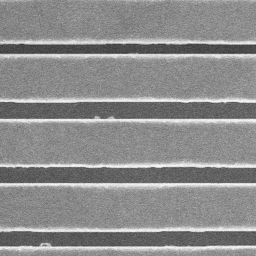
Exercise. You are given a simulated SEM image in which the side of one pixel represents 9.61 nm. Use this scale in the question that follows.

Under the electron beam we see lines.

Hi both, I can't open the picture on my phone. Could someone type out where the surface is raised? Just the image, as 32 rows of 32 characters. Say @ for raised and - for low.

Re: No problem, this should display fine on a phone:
@@@@@@@@@@@@@@@@@@@@@@@@@@@@@@@@
@@@@@@@@@@@@@@@@@@@@@@@@@@@@@@@@
@@@@@@@@@@@@@@@@@@@@@@@@@@@@@@@@
@@@@@@@@@@@@@@@@@@@@@@@@@@@@@@@@
@@@@@@@@@@@@@@@@@@@@@@@@@@@@@@@@
--------------------------------
--------------------------------
@@@@@@@@@@@@@@@@@@@@@@@@@@@@@@@@
@@@@@@@@@@@@@@@@@@@@@@@@@@@@@@@@
@@@@@@@@@@@@@@@@@@@@@@@@@@@@@@@@
@@@@@@@@@@@@@@@@@@@@@@@@@@@@@@@@
@@@@@@@@@@@@@@@@@@@@@@@@@@@@@@@@
@@@@@@@@@@@@@@@@@@@@@@@@@@@@@@@@
--------------------------------
--------------------------------
@@@@@@@@@@@@@@@@@@@@@@@@@@@@@@@@
@@@@@@@@@@@@@@@@@@@@@@@@@@@@@@@@
@@@@@@@@@@@@@@@@@@@@@@@@@@@@@@@@
@@@@@@@@@@@@@@@@@@@@@@@@@@@@@@@@
@@@@@@@@@@@@@@@@@@@@@@@@@@@@@@@@
@@@@@@@@@@@@@@@@@@@@@@@@@@@@@@@@
--------------------------------
--------------------------------
@@@@@@@@@@@@@@@@@@@@@@@@@@@@@@@@
@@@@@@@@@@@@@@@@@@@@@@@@@@@@@@@@
@@@@@@@@@@@@@@@@@@@@@@@@@@@@@@@@
@@@@@@@@@@@@@@@@@@@@@@@@@@@@@@@@
@@@@@@@@@@@@@@@@@@@@@@@@@@@@@@@@
@@@@@@@@@@@@@@@@@@@@@@@@@@@@@@@@
--------------------------------
--------------------------------
@@@@@@@@@@@@@@@@@@@@@@@@@@@@@@@@